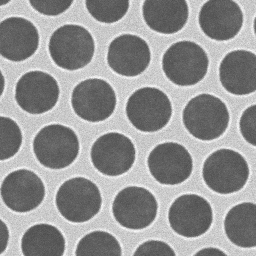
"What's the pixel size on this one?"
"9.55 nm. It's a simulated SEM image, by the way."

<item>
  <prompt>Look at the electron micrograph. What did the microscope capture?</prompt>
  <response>a regular array of holes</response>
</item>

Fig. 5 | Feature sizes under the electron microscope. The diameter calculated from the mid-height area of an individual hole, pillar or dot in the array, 431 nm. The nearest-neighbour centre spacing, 0.543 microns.